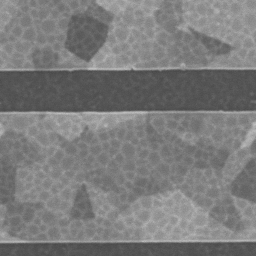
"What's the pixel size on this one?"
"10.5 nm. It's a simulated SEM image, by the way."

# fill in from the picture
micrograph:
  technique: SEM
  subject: one or a few lines or trenches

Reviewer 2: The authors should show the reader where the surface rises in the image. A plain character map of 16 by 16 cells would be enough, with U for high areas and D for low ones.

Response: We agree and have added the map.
UUUUUUUUUUUUUUUU
UUUUUUUUUUUUUUUU
UUUUUUUUUUUUUUUU
UUUUUUUUUUUUUUUU
DDDDDDDDDDDDDDDD
DDDDDDDDDDDDDDDD
DDDDDDDDDDDDDDDD
UUUUUUUUUUUUUUUU
UUUUUUUUUUUUUUUU
UUUUUUUUUUUUUUUU
UUUUUUUUUUUUUUUU
UUUUUUUUUUUUUUUU
UUUUUUUUUUUUUUUU
UUUUUUUUUUUUUUUU
UUUUUUUUUUUUUUUU
DDDDDDDDDDDDDDDD